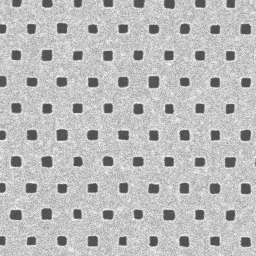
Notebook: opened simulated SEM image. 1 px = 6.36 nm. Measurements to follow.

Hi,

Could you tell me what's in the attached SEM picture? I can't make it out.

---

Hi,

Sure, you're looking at a regular array of holes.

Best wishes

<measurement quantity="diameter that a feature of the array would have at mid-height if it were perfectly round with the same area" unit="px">11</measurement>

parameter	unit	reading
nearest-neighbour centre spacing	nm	192